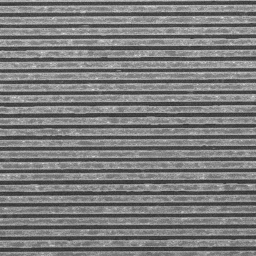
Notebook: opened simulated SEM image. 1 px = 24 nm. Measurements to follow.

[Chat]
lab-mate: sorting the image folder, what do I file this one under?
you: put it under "parallel lines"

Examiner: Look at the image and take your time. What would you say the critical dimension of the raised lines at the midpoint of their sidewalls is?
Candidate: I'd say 144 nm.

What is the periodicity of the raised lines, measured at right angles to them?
268 nanometers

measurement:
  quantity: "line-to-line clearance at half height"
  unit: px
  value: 5